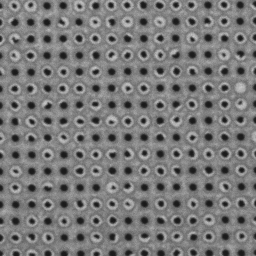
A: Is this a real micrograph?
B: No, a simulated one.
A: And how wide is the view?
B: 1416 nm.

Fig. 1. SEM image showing a regular array of holes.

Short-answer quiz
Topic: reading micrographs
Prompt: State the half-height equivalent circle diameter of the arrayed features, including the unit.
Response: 38 nanometres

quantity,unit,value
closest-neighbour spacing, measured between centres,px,15.8